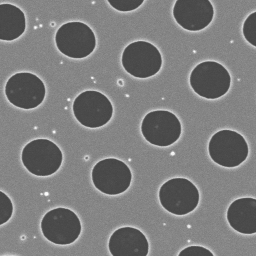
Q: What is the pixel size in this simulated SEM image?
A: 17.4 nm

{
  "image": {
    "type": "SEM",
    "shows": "a regular array of holes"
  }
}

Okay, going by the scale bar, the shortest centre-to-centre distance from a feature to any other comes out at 1200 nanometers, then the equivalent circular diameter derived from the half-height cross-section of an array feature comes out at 665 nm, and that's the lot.